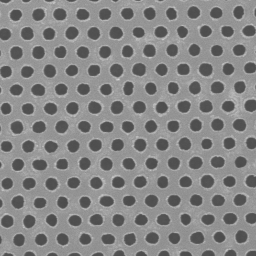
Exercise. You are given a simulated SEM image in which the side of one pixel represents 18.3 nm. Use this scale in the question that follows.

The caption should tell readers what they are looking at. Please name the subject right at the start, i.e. a regular array of holes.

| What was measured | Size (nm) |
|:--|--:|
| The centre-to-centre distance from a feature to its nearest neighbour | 391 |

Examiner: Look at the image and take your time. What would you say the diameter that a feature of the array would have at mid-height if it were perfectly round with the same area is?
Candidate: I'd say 0.227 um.